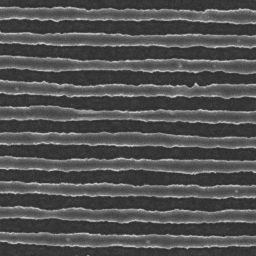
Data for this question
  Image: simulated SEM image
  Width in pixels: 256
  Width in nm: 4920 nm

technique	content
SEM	parallel lines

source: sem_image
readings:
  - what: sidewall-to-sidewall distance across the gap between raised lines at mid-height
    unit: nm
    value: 264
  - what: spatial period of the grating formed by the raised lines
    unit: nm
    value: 481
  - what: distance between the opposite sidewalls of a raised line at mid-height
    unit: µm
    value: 0.228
